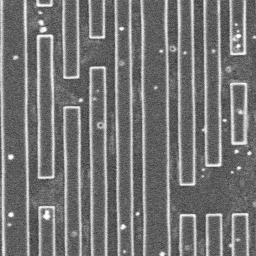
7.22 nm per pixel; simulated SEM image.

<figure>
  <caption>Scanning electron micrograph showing groups of lines, slits or small figures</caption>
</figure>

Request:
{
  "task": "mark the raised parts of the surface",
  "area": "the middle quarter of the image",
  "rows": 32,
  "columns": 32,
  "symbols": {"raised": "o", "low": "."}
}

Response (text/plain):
oooo.........oooo...oooooo...ooo
oooo...ooo...oooo..ooooooo...ooo
oooo...ooo...oooo..ooooooo...ooo
.......ooo...oooo..ooooooo...ooo
.......ooo...oooo..ooooooo...ooo
.......ooo...oooo...oooooo...ooo
.......ooo...oooo...oooooo...ooo
.......ooo...oooo...oooooo...ooo
.......ooo...oooo...oooooo...ooo
.......ooo...oooo...oooooo...ooo
.......ooo...oooo...oooooo...ooo
oooo...ooo...oooo...oooooo...ooo
oooo...ooo...oooo...oooooo...ooo
oooo...ooo...oooo...oooooo...ooo
oooo...ooo...oooo...oooooo...ooo
oooo...ooo...oooo...oooooo...ooo
oooo...ooo...oooo...oooooo...ooo
oooo...ooo...oooo...oooooo...ooo
oooo...ooo...oooo...oooooo...ooo
oooo...ooo...oooo...oooooo...ooo
oooo...ooo...oooo...oooooo...ooo
oooo...ooo...oooo...oooooo...ooo
oooo...ooo...oooo...oooooo...ooo
oooo...ooo...oooo...oooooo...ooo
oooo...ooo...oooo...oooooo...ooo
oooo...ooo...oooo...oooooo...ooo
oooo...ooo...oooo...oooooo...ooo
oooo...oooo..oooo...oooooo...ooo
oooo...oooo..oooo...oooooo...ooo
oooo...oooo..oooo...oooooo...ooo
oooo...oooo..oooo...oooooo......
oooo...oooo..oooo...oooooo......